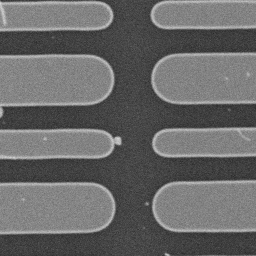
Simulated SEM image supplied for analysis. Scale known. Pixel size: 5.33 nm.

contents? groups of lines, slits or small figures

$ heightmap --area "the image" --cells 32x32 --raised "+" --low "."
+++++++++++++.......++++++++++++
++++++++++++++.....+++++++++++++
++++++++++++++.....+++++++++++++
+++++++++++++.......+++++++++++.
................................
................................
................................
+++++++++++++.......++++++++++++
++++++++++++++.....+++++++++++++
++++++++++++++.....+++++++++++++
++++++++++++++.....+++++++++++++
++++++++++++++.....+++++++++++++
+++++++++++++........+++++++++++
................................
................................
................................
+++++++++++++.......++++++++++++
++++++++++++++.....+++++++++++++
++++++++++++++.....+++++++++++++
+++++++++++++.......+++++++++++.
................................
................................
................................
+++++++++++++.......++++++++++++
++++++++++++++.....+++++++++++++
++++++++++++++.....+++++++++++++
++++++++++++++.....+++++++++++++
++++++++++++++......++++++++++++
+++++++++++++........+++++++++++
................................
................................
................................